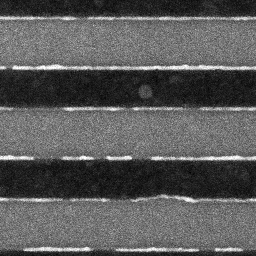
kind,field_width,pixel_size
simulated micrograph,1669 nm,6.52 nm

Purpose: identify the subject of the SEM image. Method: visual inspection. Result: one or a few lines or trenches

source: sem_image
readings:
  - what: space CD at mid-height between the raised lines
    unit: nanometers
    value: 304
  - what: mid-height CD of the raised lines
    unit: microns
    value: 0.285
